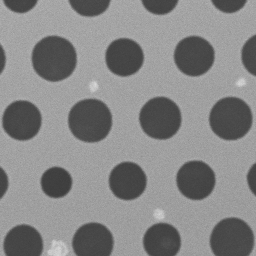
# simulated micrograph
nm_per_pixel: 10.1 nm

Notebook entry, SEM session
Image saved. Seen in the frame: a regular array of holes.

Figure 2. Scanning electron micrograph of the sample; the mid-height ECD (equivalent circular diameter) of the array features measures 413 nanometers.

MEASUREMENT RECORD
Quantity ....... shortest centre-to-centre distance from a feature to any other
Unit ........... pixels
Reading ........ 69.9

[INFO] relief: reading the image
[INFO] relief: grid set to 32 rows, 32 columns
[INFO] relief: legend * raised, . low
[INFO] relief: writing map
*....****.....****....*****....*
**.******....******..*******..**
********************************
********************************
******.*****************.******.
*****....*****...*****....*****.
.***......***.....****.....***..
.***......***.....****.....***..
.***.....****.....****....*****.
*****....******.********.*******
********************************
********************************
**.*******...******..******...**
*....****.....****....****.....*
.....****.....***......***......
.....****.....****.....***......
*....****.....****....*****....*
**..******...***************..**
********************************
********************************
***************..******...******
.*****...*****....****.....****.
.****....*****....****.....****.
.****....*****....****.....****.
******..******....*****...******
********************************
********************************
****************************..**
**..******...******...*****....*
*....****.....****....****......
.....****.....****.....***......
*....****.....****....*****....*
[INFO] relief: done